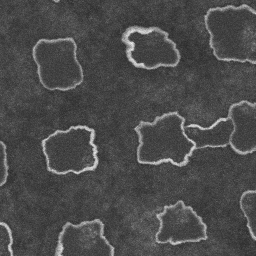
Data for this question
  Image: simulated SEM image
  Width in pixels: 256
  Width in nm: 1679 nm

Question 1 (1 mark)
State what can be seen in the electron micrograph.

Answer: raised bodies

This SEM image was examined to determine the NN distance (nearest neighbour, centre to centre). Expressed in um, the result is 0.595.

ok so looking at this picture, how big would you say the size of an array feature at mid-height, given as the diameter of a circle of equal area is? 0.32 µm